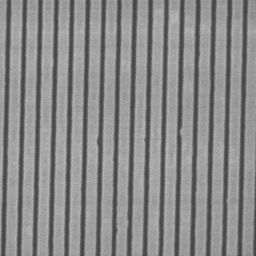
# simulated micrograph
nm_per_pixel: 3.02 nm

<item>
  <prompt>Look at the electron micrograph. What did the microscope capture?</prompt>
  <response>parallel lines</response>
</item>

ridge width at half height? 0.0313 microns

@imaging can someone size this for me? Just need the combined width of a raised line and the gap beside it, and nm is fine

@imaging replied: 47.6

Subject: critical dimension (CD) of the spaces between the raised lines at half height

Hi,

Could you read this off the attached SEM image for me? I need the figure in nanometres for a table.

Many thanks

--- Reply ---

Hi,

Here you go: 15.5